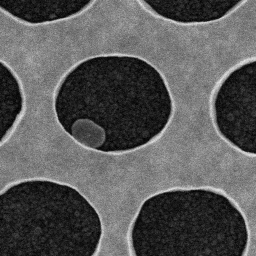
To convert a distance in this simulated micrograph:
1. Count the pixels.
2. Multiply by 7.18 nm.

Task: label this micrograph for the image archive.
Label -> holes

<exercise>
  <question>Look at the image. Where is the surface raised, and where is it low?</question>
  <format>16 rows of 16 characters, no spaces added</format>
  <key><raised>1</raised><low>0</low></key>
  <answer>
0000011110000001
1111111111111111
1111111111111111
1111111111111111
0111000000111110
0111000000111100
0110000000011000
0111000000011000
1111000000111100
1111111111111110
1111111111111111
1000111111111111
0000011110000011
0000001110000001
0000001100000001
0000001100000001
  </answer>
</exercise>